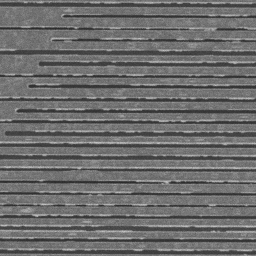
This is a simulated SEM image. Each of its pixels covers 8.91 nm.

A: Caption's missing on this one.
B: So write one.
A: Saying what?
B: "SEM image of parallel lines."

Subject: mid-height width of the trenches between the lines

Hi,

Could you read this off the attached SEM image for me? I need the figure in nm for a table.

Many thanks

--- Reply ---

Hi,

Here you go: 31.2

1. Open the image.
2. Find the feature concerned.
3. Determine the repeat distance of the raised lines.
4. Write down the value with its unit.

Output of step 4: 105 nm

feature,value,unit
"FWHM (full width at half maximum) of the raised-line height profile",78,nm